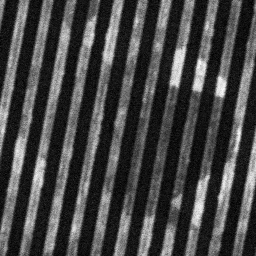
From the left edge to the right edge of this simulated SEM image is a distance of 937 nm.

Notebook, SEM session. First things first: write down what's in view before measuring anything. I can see parallel lines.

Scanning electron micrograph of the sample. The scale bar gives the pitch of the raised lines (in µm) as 0.0851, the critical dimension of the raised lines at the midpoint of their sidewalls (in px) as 9.1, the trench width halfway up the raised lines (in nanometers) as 53.1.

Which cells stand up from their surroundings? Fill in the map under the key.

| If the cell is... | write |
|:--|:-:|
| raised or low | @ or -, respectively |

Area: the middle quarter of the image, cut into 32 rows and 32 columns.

---@@@---@@@----@@---@@@---@@@--
---@@@---@@----@@@---@@----@@---
---@@----@@----@@----@@----@@---
---@@----@@----@@----@@----@@---
---@@----@@----@@----@@----@@---
---@@----@@----@@---@@@---@@@---
--@@@---@@----@@@---@@----@@----
--@@@---@@----@@----@@----@@----
--@@----@@----@@----@@----@@----
--@@----@@----@@----@@----@@----
--@@----@@----@@----@@---@@@---@
--@@----@@----@@----@----@@----@
-@@@---@@@---@@@---@@----@@----@
-@@----@@@---@@----@@----@@----@
-@@----@@----@@----@@----@@----@
-@@----@@----@@----@@----@@---@@
-@@----@@----@@---@@@---@@@---@@
@@@---@@@---@@@---@@----@@----@@
@@----@@@---@@----@@----@@----@@
@@----@@----@@----@@----@@----@@
@@----@@----@@----@@----@@---@@@
@@----@@----@@----@@---@@@---@@@
@@---@@@---@@@---@@----@@----@@-
@@---@@----@@----@@----@@----@@-
@----@@----@@----@@----@@----@@-
@----@@----@@----@@----@@----@@-
@----@@----@@----@@---@@@---@@@-
@----@@----@@---@@----@@----@@--
@---@@----@@@---@@----@@----@@--
----@@----@@----@@----@@----@@--
----@@----@@----@@----@@----@@--
----@@----@@----@@----@@----@@--